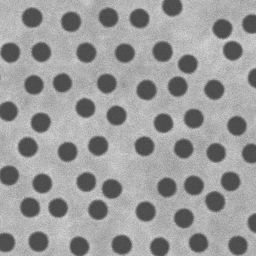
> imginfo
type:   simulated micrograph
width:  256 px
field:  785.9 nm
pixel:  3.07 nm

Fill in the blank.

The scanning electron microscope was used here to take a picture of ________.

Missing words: a regular array of holes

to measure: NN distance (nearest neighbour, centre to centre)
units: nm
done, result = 92.3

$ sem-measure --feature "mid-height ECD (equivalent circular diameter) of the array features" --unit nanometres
60.7